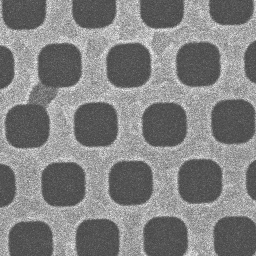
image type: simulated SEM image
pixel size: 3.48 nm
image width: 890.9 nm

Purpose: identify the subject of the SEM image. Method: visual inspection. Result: holes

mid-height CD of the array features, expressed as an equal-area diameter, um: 0.164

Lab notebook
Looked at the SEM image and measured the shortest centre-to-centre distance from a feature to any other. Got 234 nanometers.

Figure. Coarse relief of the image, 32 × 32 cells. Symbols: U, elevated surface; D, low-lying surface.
DDDDDDUUUDDDDDDUUDDDDDDUUUDDDDDD
DDDDDDUUUDDDDDDUUDDDDDDUUUDDDDDD
DDDDDDUUUDDDDDUUUUDDDDDUUUUDDDDU
UDDDDUUUUUUDUUUUUUUDDDUUUUUUUUUU
UUUUUUUUUUUUUUUUUUUUUUUUUUUUUUUU
UUUUUUDDDUUUUUUDDDUUUUUDDDDUUUUD
DUUUUDDDDDUUUUDDDDDUUUDDDDDUUUUD
DDUUUDDDDDUUUDDDDDDUUUDDDDDDUUUD
DDUUUDDDDDUUUDDDDDDUUUDDDDDDUUUD
DDUUUDDDDDUUUDDDDDDUUUDDDDDUUUUD
DUUUUDDDDUUUUUDDDDUUUUUDDDDUUUUU
UUUUDDDUUUUUUUUUUUUUUUUUUUUUUUUU
UUUUDDDUUUUUUUUUUUUUUUUUUUUUDDUU
UDDDDDUUUUDDDDUUUUDDDDDUUUUDDDDD
UDDDDDUUUDDDDDDUUUDDDDDUUUDDDDDD
UDDDDDUUUDDDDDDUUUDDDDDUUUDDDDDD
UDDDDDUUUDDDDDDUUUDDDDDUUUDDDDDD
UDDDDDUUUUDDDDUUUUDDDDDUUUUDDDDU
UUDDUUUUUUUUUUUUUUUUUUUUUUUUUUUU
UUUUUUUUUUUUUUUUUUUUUUUUUUUUUUUU
UUUUUUDDDDUUUUDDDDUUUUUDDDDUUUUD
DDUUUDDDDDUUUUDDDDDUUUDDDDDDUUUD
DDUUUDDDDDDUUUDDDDDUUUDDDDDDUUUD
DDUUUDDDDDDUUDDDDDDUUUDDDDDDUUUD
DDUUUDDDDDDUUUDDDDDUUUUDDDDUUUUD
DUUUUUDDDDUUUUUDDDUUUUUUDUUUUUUU
UUUUUUUUUUUUUUUUUUUUUUUUUUUUUUUU
UUUUUUUUUUUDDDUUUUUDDDDUUUUDDDDD
UDDDDDUUUUDDDDDUUUDDDDDUUUUDDDDD
UDDDDDDUUDDDDDDUUUDDDDDDUUUDDDDD
UDDDDDDUUDDDDDDUUUDDDDDDUUUDDDDD
UDDDDDDUUUDDDDDUUUDDDDDUUUUDDDDD